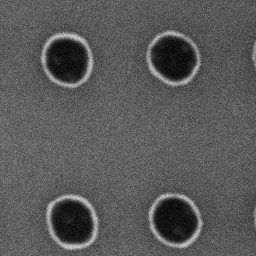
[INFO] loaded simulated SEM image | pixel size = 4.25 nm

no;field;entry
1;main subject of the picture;raised bodies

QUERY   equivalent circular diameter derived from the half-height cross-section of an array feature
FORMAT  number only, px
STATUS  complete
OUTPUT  50.4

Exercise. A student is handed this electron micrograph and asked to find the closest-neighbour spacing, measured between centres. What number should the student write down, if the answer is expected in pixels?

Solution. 104